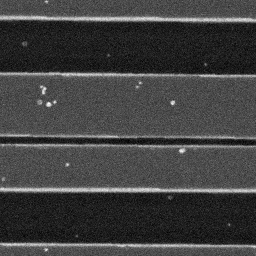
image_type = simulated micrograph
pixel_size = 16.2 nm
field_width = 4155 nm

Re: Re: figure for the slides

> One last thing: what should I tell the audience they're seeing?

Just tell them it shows lines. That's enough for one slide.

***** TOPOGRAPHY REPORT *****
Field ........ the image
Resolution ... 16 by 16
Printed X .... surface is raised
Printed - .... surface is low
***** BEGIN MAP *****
XXXXXXXXXXXXXXXX
----------------
----------------
----------------
----------------
XXXXXXXXXXXXXXXX
XXXXXXXXXXXXXXXX
XXXXXXXXXXXXXXXX
XXXXXXXXXXXXXXXX
XXXXXXXXXXXXXXXX
XXXXXXXXXXXXXXXX
XXXXXXXXXXXXXXXX
----------------
----------------
----------------
XXXXXXXXXXXXXXXX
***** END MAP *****